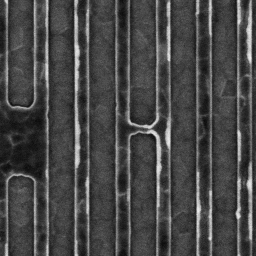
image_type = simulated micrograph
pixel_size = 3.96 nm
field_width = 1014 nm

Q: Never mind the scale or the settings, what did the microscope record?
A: parallel lines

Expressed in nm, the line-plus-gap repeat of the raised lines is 161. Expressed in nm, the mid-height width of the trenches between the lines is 108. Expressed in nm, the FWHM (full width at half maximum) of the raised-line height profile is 54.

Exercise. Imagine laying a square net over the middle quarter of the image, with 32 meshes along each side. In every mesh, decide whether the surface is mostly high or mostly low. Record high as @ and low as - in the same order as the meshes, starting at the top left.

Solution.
---@@@-------@@@-------@@@------
---@@@-------@@@-------@@@------
---@@@-------@@@-------@@@------
---@@@-------@@@-------@@@------
---@@@-------@@@-------@@@------
---@@@-------@@@-------@@@------
---@@@-------@@@-------@@@------
---@@@-------@@@-------@@@------
---@@@-------@@@-------@@@------
---@@@-------@@@-------@@@------
---@@@-------@@@-------@@@------
---@@@-------@@@-------@@@------
---@@@-------@@@-------@@@------
---@@@-------@@@-------@@@------
---@@@-------@@@@------@@@------
---@@@-------@@@@@@@@@@@@@------
---@@@-------@@@@@@@@@@@@@------
---@@@-------@@@@@----@@@@------
---@@@-------@@@-------@@@------
---@@@-------@@@-------@@@------
---@@@-------@@@-------@@@------
---@@@-------@@@-------@@@------
---@@@-------@@@-------@@@------
---@@@-------@@@-------@@@------
---@@@-------@@@-------@@@------
---@@@-------@@@-------@@@------
---@@@-------@@@-------@@@------
---@@@-------@@@-------@@@------
---@@@-------@@@-------@@@------
---@@@-------@@@-------@@@------
---@@@-------@@@-------@@@------
---@@@-------@@@-------@@@------